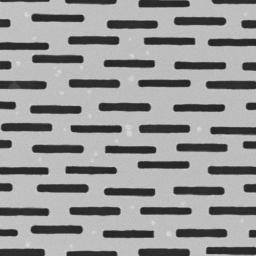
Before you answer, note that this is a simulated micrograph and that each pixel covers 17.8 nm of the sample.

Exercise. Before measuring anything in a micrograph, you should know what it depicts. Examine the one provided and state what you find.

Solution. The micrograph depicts a regular array of holes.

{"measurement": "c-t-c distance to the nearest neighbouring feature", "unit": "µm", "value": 0.688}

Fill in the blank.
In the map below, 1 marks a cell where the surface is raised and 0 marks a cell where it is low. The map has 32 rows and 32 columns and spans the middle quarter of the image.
11111111110000000000000111110000
11111111111111111111111111111111
11111111111111111111111111111111
11111111111111111111111111111111
10000000000000111110000000000000
10000000000000111110000000000001
11111111111111111111111111111111
11111111111111111111111111111111
11111111111111111111111111111111
11111111111111111111111111111111
00001111100000000000001111100000
00000111100000000000001111100000
00001111111111111111111111111111
11111111111111111111111111111111
11111111111111111111111111111111
11000000000000111110000000000001
11000000000000011110000000000001
11111111111111111111111111111111
11111111111111111111111111111111
11111111111111111111111111111111
00001111111000000000001111110000
00000111110000000000000111110000
11111111111110000000001111111111
11111111111111111111111111111111
11111111111111111110000000000001
10000111111111111100000000000001
00000000000001111111111111111111
10000000000001111111111111111111
11111111111111111111111111111111
11111111111111111111111111111111
00000011111111111111111111111111
00000011110000000000000111100000